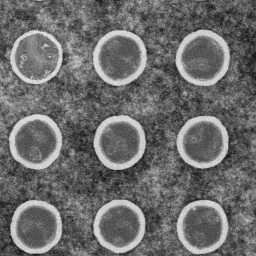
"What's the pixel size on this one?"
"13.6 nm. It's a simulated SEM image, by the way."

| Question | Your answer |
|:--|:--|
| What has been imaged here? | a regular array of raised bodies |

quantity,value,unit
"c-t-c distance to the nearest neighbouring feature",1.13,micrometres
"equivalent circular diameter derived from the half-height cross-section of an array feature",48.1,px